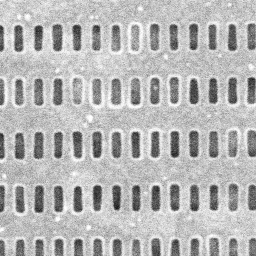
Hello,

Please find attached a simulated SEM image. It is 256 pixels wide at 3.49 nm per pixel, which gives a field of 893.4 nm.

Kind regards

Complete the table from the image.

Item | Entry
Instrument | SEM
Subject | groups of lines, slits or small figures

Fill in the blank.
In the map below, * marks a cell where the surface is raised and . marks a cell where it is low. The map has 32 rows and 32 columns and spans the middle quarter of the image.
********************************
********************************
********************************
**..*************.****..**...***
**...**..***..***..**...**...**.
**...**..***..**...**...**...**.
**...**...**..**...**...**...**.
**...**...*...**...**...**...**.
**...**...*....*...**...**...**.
**..***...*....*...**...***..**.
********.***..***.**************
********************************
********************************
********************************
********************************
********************************
**********************.****.****
**...**..***..***..**...**...**.
**...**...**..***..**...**...**.
**...**...**..***..**...***..**.
**...**...**..***..**...***..**.
**...**...**..***..**...***..**.
**...**...**..***..**...***..**.
**...**..***..***..***..***.****
********************************
********************************
********************************
********************************
********************************
********************************
***.***..***..***..***..***..***
**...**...**..***..***..**...**.